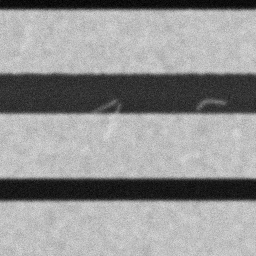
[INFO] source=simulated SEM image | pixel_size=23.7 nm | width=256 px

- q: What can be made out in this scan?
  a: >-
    lines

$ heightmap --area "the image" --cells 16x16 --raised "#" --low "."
................
################
################
################
################
................
................
################
################
################
################
................
................
################
################
################